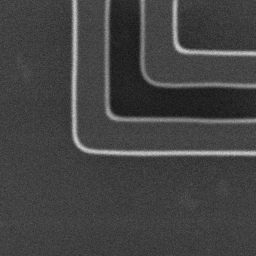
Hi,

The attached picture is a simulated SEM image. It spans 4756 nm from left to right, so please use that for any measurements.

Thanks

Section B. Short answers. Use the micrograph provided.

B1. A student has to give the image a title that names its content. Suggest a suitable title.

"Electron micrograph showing groups of lines, slits or small figures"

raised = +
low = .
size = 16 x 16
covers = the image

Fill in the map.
.....++..++.....
.....++..++.....
.....++..++.....
.....++..+++++++
.....++..+++++++
.....++.........
.....++.........
.....+++++......
.....+++++++++++
.......+++++++++
................
................
................
................
................
................